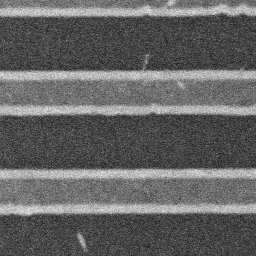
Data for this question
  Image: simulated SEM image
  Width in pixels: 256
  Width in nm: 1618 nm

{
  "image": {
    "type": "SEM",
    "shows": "one or a few lines or trenches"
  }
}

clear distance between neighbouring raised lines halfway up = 408 nanometres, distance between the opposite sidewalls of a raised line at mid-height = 213 nanometres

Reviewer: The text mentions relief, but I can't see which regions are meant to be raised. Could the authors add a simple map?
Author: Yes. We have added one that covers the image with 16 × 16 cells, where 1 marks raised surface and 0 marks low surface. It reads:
1111111111111111
0000000000000000
0000000000000000
0000000000000000
0000000000000000
1111111111111111
1111111111111111
0000000000000000
0000000000000000
0000000000000000
0000000000000000
1111111111111111
1111111111111111
0000000000000000
0000000000000000
0000000000000000